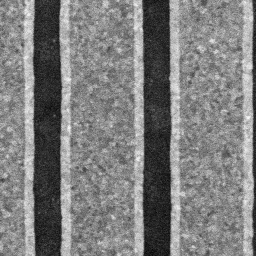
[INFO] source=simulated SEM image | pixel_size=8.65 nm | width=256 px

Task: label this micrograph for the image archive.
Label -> one or a few lines or trenches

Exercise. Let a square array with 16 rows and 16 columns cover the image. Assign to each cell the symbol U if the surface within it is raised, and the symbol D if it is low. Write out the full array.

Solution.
UUDDUUUUUDDUUUUD
UUDDUUUUUDDUUUUD
UUDDUUUUUDDUUUUD
UUDDUUUUUDDUUUUD
UUDDUUUUUDDUUUUD
UUDDUUUUUDDUUUUD
UUDDUUUUUDDUUUUD
UUDDUUUUUDDUUUUD
UUDDUUUUUDDUUUUD
UUDDUUUUUDDUUUUD
UUDDUUUUUDDUUUUD
UUDDUUUUUDDUUUUU
UUDDUUUUUDDUUUUU
UUDDUUUUUDDUUUUD
UUDDUUUUUDDUUUUD
UUDDUUUUUDDUUUUD